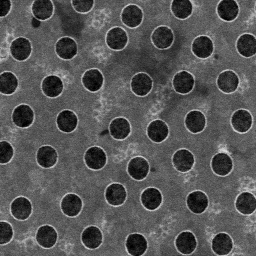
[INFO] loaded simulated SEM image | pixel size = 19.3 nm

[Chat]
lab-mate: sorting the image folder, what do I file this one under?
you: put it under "a regular array of holes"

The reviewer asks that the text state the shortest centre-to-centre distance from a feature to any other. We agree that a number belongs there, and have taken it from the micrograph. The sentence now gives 0.744 microns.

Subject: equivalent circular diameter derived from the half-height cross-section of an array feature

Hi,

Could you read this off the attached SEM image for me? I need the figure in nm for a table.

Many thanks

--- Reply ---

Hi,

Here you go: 434